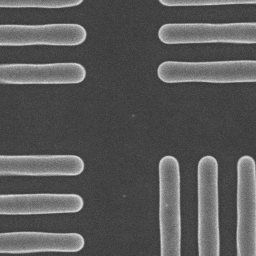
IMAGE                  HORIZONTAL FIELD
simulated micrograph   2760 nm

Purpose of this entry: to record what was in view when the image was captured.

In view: groups of lines, slits or small figures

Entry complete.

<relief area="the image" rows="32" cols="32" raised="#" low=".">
##########...........######.....
................................
................................
##########..........############
###########.........############
.##...####......................
................................
................................
##########..........############
###########.........############
................................
................................
................................
................................
................................
................................
................................
................................
................................
................................
##########..........##...##...##
##########..........##...##...##
....................##...##...##
....................##...##...##
##########..........##...##...##
##########..........##...##...##
########............##...##...##
....................##...##...##
....................##...##...##
##########..........##...##...##
##########..........##...##...##
####................##...##...##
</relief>